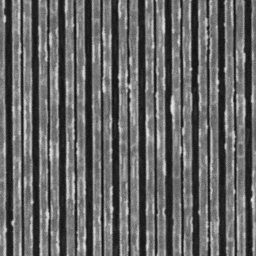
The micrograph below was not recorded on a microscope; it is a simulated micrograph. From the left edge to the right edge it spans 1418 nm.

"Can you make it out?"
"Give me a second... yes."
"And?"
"parallel lines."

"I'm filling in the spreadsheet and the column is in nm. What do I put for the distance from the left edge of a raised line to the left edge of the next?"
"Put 72.9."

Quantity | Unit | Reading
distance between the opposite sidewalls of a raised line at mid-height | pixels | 8.38